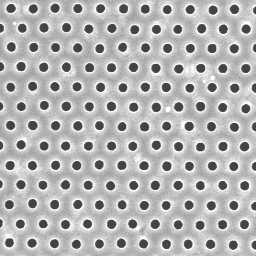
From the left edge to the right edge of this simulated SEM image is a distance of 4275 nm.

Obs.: a regular array of holes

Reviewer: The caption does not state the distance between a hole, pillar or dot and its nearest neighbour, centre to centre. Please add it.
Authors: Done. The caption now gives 363 nm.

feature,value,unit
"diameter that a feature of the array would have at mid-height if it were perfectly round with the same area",160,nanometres